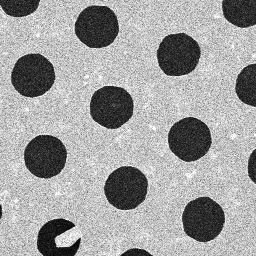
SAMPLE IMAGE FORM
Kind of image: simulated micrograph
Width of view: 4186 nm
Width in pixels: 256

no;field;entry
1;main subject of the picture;a regular array of holes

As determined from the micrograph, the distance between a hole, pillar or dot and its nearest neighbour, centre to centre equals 1320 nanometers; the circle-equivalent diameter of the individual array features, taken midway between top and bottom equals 717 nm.